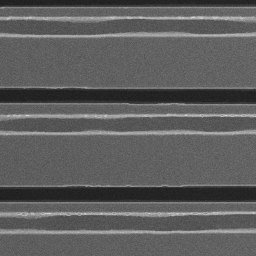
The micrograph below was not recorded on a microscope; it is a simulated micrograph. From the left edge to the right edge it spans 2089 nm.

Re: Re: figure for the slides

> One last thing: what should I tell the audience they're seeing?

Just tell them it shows lines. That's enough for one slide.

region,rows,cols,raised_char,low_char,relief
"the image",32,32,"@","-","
--------------------------------
@@@@@@@@@@@@@@@@@@@@@@@@@@@@@@@@
@@@@@@@@@@@@@@@@@@@@@@@@@@@@@@@@
@@@@@@@@@@@@@@@@@@@@@@@@@@@@@@@@
@@@@@@@@@@@@@@@@@@@@@@@@@@@@@@@@
@@@@@@@@@@@@@@@@@@@@@@@@@@@@@@@@
@@@@@@@@@@@@@@@@@@@@@@@@@@@@@@@@
@@@@@@@@@@@@@@@@@@@@@@@@@@@@@@@@
@@@@@@@@@@@@@@@@@@@@@@@@@@@@@@@@
@@@@@@@@@@@@@@@@@@@@@@@@@@@@@@@@
@@@@@@@@@@@@@@@@@@@@@@@@@@@@@@@@
--------------------------------
--------------------------------
@@@@@@@@@@@@@@@@@@@@@@@@@@@@@@@@
@@@@@@@@@@@@@@@@@@@@@@@@@@@@@@@@
@@@@@@@@@@@@@@@@@@@@@@@@@@@@@@@@
@@@@@@@@@@@@@@@@@@@@@@@@@@@@@@@@
@@@@@@@@@@@@@@@@@@@@@@@@@@@@@@@@
@@@@@@@@@@@@@@@@@@@@@@@@@@@@@@@@
@@@@@@@@@@@@@@@@@@@@@@@@@@@@@@@@
@@@@@@@@@@@@@@@@@@@@@@@@@@@@@@@@
@@@@@@@@@@@@@@@@@@@@@@@@@@@@@@@@
@@@@@@@@@@@@@@@@@@@@@@@@@@@@@@@@
--------------------------------
--------------------------------
@@@@@@@@@@@@@@@@@@@@@@@@@@@@@@@@
@@@@@@@@@@@@@@@@@@@@@@@@@@@@@@@@
@@@@@@@@@@@@@@@@@@@@@@@@@@@@@@@@
@@@@@@@@@@@@@@@@@@@@@@@@@@@@@@@@
@@@@@@@@@@@@@@@@@@@@@@@@@@@@@@@@
@@@@@@@@@@@@@@@@@@@@@@@@@@@@@@@@
@@@@@@@@@@@@@@@@@@@@@@@@@@@@@@@@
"